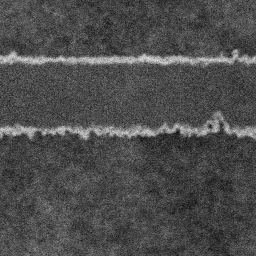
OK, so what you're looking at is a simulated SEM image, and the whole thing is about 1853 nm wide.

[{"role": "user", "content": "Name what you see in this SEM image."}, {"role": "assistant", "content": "one or a few lines or trenches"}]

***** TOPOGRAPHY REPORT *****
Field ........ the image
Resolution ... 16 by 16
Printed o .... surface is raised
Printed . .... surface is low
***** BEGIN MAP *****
................
................
................
................
oooooooooooooooo
oooooooooooooooo
oooooooooooooooo
oooooooooooooooo
................
................
................
................
................
................
................
................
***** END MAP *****